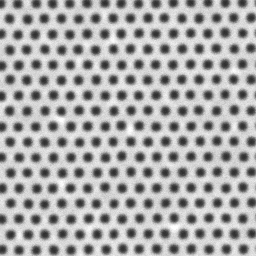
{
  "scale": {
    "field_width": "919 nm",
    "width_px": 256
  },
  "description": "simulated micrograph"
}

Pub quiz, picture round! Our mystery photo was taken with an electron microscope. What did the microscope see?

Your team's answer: a regular array of holes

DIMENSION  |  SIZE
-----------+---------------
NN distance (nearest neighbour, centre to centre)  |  60.3 nanometers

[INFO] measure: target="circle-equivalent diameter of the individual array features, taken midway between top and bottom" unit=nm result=37.1